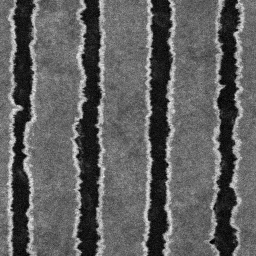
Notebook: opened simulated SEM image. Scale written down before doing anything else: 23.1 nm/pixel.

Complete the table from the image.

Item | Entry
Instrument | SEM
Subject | one or a few lines or trenches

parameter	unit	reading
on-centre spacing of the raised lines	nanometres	1600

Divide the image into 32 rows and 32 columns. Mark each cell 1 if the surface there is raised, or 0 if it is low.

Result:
11000111110001111110011111110011
11001111110001111110001111110011
10001111110001111110001111100011
11001111110001111110001111100011
11001111110001111110011111100011
11001111110001111110011111100011
11001111110001111110001111110011
10001111110001111110001111100011
10001111110001111110001111100011
11001111110001111110001111100011
11001111110001111100011111100011
10001111110001111100011111100011
10001111110001111110011111100011
11001111110001111110011111100011
11001111110001111110011111100011
10001111100011111100011111110111
11011111100011111100011111100111
11011111100011111100011111100011
10011111100001111110011111100011
10011111100001111110011111100011
10011111110001111110011111100011
10001111110001111110011111100111
10001111110001111110011111100111
10001111110001111110011111100111
10001111110001111100011111100011
10001111110001111100011111100011
10001111110011111100011111100111
10001111110011111100011111100111
10001111100001111100011111100011
10001111100001111100011111000011
10001111110001111100011111000011
10001111110011111100011111100111